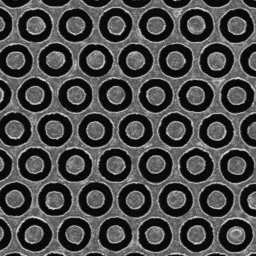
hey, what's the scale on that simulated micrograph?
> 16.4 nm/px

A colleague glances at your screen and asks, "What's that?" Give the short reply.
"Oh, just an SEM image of a regular array of ring-shaped grooves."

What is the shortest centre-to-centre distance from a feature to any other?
649 nm